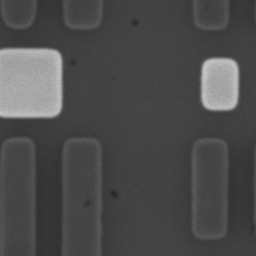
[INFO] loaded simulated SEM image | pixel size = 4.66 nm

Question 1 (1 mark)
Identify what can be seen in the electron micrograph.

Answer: wiring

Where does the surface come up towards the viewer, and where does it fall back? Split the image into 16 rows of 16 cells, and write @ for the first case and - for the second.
@@--@@------@@--
@@--@@------@@--
----------------
@@@@------------
@@@@---------@@-
@@@@---------@@-
@@@@---------@@-
----------------
----------------
@@--@@------@@--
@@--@@------@@--
@@--@@------@@--
@@--@@------@@--
@@--@@------@@--
@@--@@------@@--
@@--@@----------